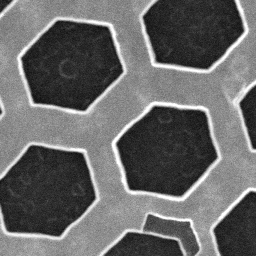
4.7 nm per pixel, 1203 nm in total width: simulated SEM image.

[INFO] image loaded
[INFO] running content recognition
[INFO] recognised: holes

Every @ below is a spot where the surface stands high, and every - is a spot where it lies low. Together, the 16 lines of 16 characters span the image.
@@@@@@@@@------@
@@@---@@@------@
@@-----@@------@
@------@@@----@@
@-------@@@@@@@@
@@-----@@@@@@@@@
@@----@@@@@@@@@-
@@@@@@@@@----@@-
@@@@@@@@-----@@@
@@---@@-------@@
@-----@@-----@@@
------@@----@@@@
------@@@@@@@@@-
-----@@@@@@@@@--
@---@@@@@@@@@---
@@@@@@@----@@@--